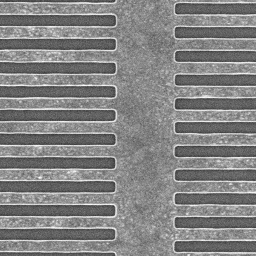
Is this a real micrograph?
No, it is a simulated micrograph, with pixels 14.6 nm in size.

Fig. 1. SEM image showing groups of lines, slits or small figures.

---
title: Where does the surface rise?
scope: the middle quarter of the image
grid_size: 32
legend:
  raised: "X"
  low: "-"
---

-------------XXXXXXXXXXXXXXXXXXX
-------------XXXXXXXXXXXXXXXXXXX
-------------XXXXXXXXXXXXXXXX--X
XXXXXXXXXXXXXXXXXXXXXXXXXXX-----
XXXXXXXXXXXXXXXXXXXXXXXXXXXX----
------------XXXXXXXXXXXXXXXX----
-------------XXXXXXXXXXXXXXXXXXX
-------------XXXXXXXXXXXXXXXXXXX
-------------XXXXXXXXXXXXXXX----
XXXXXXXXXXXXXXXXXXXXXXXXXXXX----
XXXXXXXXXXXXXXXXXXXXXXXXXXX-----
-------------XXXXXXXXXXXXXXXX---
-------------XXXXXXXXXXXXXXXXXXX
-------------XXXXXXXXXXXXXXXXXXX
XXXX------XXXXXXXXXXXXXXXX-X----
XXXXXXXXXXXXXXXXXXXXXXXXXXX-----
XXXXXXXXXXXXXXXXXXXXXXXXXXXX----
------------XXXXXXXXXXXXXXXXX-XX
-------------XXXXXXXXXXXXXXXXXXX
-------------XXXXXXXXXXXXXXXXXXX
------XXXXXXXXXXXXXXXXXXXXXX----
XXXXXXXXXXXXXXXXXXXXXXXXXXX-----
XXXXXXXXXXXXXXXXXXXXXXXXXXX-----
-------------XXXXXXXXXXXXXXXX---
-------------XXXXXXXXXXXXXXXXXXX
-------------XXXXXXXXXXXXXXXXXXX
XXXXXXXXXXXXXXXXXXXXXXXXXXXX----
XXXXXXXXXXXXXXXXXXXXXXXXXXXX----
XXXXXXXXXXXXXXXXXXXXXXXXXXXX----
-------------XXXXXXXXXXXXXXXXXXX
-------------XXXXXXXXXXXXXXXXXXX
-------------XXXXXXXXXXXXXXXXXXX